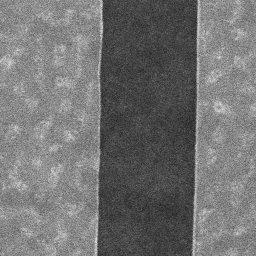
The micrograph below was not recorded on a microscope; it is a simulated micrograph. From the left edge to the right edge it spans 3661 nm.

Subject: one or a few lines or trenches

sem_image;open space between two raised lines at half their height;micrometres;1.38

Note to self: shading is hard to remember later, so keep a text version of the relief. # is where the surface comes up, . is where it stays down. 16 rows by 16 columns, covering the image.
######......####
######......####
######......####
######......####
######......####
######......####
######......####
######......####
######......####
######......####
######......####
######......####
######......####
######......####
######......####
######......####